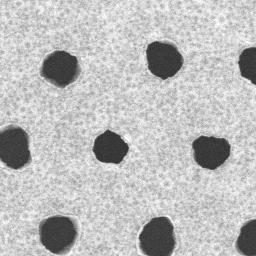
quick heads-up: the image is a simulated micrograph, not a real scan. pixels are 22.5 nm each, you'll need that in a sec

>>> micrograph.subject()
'holes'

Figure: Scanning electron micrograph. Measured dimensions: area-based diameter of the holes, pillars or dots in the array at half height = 824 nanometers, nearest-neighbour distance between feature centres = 2270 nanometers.